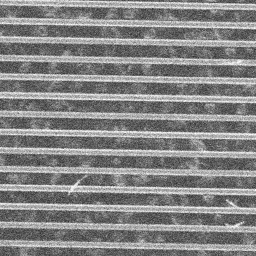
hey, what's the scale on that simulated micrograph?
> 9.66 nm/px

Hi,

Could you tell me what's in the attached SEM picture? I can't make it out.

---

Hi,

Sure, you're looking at parallel lines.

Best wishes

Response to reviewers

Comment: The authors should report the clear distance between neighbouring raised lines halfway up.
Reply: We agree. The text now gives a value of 127 nanometres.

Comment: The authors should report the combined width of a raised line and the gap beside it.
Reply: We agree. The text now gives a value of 179 nm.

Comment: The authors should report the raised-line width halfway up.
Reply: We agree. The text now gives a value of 50.7 nanometres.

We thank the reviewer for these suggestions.